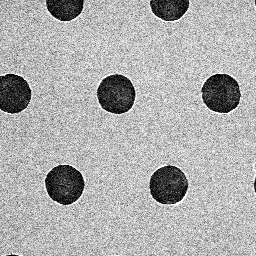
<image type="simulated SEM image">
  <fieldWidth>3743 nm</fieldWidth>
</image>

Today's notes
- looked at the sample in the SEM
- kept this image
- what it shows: holes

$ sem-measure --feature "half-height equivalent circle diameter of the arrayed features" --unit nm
581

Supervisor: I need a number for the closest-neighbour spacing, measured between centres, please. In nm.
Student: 1520